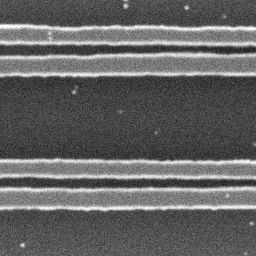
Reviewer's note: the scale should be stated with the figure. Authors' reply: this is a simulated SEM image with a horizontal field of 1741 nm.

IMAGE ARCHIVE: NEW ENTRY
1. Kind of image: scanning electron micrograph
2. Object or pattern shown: lines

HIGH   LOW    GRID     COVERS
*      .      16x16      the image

................
................
****************
****************
****************
................
................
................
................
................
****************
****************
****************
................
................
................